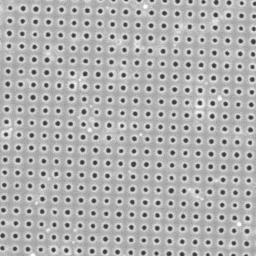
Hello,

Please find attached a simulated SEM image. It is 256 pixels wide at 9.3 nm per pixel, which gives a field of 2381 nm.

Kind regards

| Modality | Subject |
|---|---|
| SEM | a regular array of holes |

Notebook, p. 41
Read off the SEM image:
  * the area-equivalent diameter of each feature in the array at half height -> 48.1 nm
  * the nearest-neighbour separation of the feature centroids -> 116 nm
